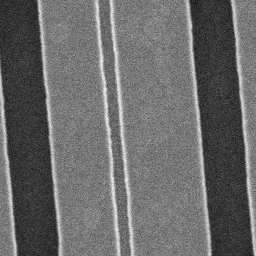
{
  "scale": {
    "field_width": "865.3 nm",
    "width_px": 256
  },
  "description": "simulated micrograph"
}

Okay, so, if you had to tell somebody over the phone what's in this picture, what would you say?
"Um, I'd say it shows lines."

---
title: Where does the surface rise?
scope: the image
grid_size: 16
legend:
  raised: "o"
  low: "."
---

..oooooooooo...o
...ooooooooo...o
...ooooooooo...o
...ooooooooo...o
...ooooooooo...o
...ooooooooo...o
...ooooooooo...o
...ooooooooo...o
...oooooooooo..o
...oooooooooo..o
o..oooooooooo..o
o..oooooooooo..o
o..oooooooooo...
o...ooooooooo...
o...ooooooooo...
o...ooooooooo...